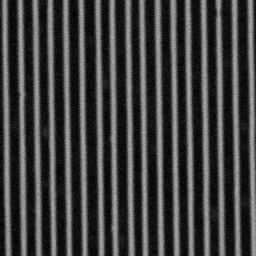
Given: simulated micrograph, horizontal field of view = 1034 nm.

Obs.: parallel lines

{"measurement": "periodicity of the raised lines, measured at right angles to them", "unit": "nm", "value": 61.9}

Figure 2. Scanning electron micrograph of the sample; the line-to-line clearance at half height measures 44.4 nanometers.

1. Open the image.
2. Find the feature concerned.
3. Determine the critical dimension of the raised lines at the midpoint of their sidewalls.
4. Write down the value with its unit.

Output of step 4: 17.1 nanometres